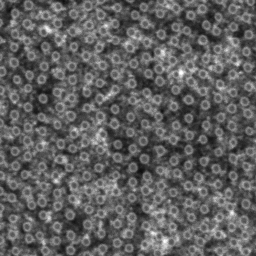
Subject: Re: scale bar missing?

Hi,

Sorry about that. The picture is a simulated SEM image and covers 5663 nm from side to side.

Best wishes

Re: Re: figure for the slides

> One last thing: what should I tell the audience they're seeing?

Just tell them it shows a regular array of raised bodies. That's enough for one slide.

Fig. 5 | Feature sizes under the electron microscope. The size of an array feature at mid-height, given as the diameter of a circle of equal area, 168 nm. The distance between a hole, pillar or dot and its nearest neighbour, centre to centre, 14.4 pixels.